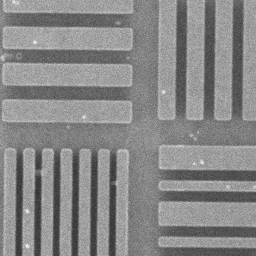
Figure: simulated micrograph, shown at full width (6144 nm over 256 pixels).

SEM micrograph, groups of lines, slits or small figures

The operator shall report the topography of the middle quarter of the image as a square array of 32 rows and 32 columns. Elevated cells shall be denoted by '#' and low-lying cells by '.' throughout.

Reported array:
#################.......####...#
#################.......####...#
#################.......####...#
#################.......####...#
#################.......####...#
........................####...#
........................####...#
........................####...#
........................####...#
################........####...#
#################.......####...#
#################.......####...#
#################.......####...#
#################.......###....#
........########................
................................
................................
................................
................................
................................
........................########
#...##..................########
##..###..##..###........########
##..###..##..###........########
##..###..##..###........########
##..###..##..###........########
##..##...##..###................
##..##...##..###................
##..##...##..###................
##..##...##..###........########
##..##...##..###........########
##..##...##..###........########